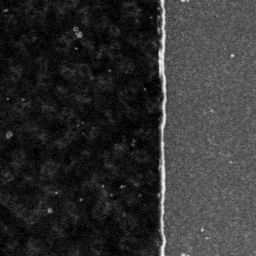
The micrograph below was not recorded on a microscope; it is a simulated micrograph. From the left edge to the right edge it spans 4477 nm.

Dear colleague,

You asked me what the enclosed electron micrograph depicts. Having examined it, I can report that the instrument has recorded one or a few lines or trenches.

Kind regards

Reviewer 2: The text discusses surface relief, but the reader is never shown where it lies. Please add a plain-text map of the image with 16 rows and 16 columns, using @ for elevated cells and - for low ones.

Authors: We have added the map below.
@@@@@@@@@@------
@@@@@@@@@@------
@@@@@@@@@@------
@@@@@@@@@@------
@@@@@@@@@@------
@@@@@@@@@@------
@@@@@@@@@@------
@@@@@@@@@@------
@@@@@@@@@@------
@@@@@@@@@@------
@@@@@@@@@@------
@@@@@@@@@@------
@@@@@@@@@@------
@@@@@@@@@@------
@@@@@@@@@@------
@@@@@@@@@@------